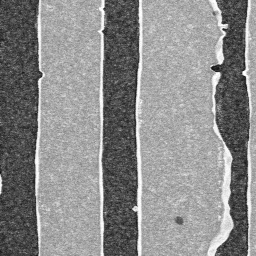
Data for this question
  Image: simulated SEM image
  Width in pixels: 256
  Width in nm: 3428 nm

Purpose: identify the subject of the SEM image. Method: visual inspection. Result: one or a few lines or trenches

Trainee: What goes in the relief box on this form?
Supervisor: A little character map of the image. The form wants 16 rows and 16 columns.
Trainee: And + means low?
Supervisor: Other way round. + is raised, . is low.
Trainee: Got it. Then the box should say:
..++++...+++++..
..++++...+++++.+
..++++...+++++.+
...+++...+++++.+
...+++...++++..+
...+++...++++..+
..++++...++++...
..++++...++++...
..++++...+++++..
..++++...+++++..
..++++...+++++..
..++++...+++++..
..++++...+++++..
..++++...+++++..
..++++...+++++..
..++++...++++...